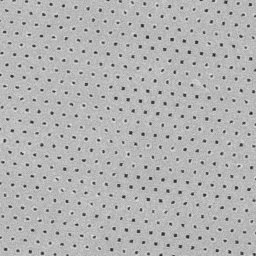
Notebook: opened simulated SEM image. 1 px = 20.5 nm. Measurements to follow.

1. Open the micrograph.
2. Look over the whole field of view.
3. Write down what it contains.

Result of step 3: a regular array of holes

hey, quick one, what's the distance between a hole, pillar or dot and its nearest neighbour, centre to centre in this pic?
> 249 nm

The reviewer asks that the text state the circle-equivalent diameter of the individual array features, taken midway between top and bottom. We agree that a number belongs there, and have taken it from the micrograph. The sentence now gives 0.0836 um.